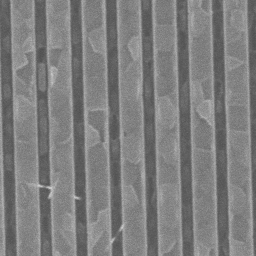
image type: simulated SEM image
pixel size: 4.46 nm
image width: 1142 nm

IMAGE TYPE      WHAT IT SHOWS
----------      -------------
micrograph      parallel lines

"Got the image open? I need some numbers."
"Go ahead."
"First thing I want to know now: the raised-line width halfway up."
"0.105 µm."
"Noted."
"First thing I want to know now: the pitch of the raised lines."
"0.158 microns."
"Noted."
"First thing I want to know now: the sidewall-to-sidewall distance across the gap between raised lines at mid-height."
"53 nm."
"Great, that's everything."